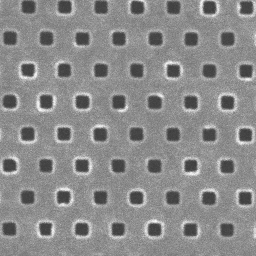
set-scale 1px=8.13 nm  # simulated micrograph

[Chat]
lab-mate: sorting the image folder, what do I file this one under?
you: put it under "a regular array of holes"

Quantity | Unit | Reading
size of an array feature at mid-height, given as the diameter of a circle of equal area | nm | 126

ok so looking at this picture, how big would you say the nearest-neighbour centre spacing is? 292 nanometres